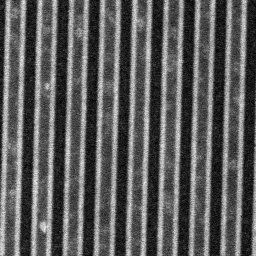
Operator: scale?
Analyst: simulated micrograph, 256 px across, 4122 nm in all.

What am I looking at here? parallel lines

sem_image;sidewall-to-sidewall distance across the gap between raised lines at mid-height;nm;248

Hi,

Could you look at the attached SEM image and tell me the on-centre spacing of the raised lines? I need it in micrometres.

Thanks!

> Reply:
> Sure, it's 0.508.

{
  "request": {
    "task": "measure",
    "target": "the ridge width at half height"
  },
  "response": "262 nm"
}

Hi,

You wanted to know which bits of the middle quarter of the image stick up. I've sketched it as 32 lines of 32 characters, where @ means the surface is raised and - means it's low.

-@@@@----@@@@----@@@@----@@@@---
-@@@@----@@@@----@@@@----@@@@---
-@@@@----@@@@----@@@@----@@@@---
-@@@@----@@@@----@@@@----@@@@---
-@@@@----@@@@----@@@@----@@@@---
-@@@@----@@@@----@@@@----@@@@---
-@@@@----@@@@----@@@@----@@@@---
-@@@@----@@@@----@@@@----@@@@---
-@@@@----@@@@----@@@@----@@@@---
-@@@@----@@@@----@@@@----@@@@---
-@@@@----@@@@----@@@@----@@@@---
-@@@@----@@@@----@@@@----@@@@---
-@@@@----@@@@----@@@@----@@@@---
-@@@@----@@@@----@@@@----@@@@---
-@@@@----@@@@----@@@@----@@@----
-@@@@----@@@@----@@@@----@@@----
-@@@@----@@@@----@@@@----@@@----
-@@@@----@@@@----@@@-----@@@----
-@@@@----@@@@----@@@-----@@@----
-@@@@----@@@@----@@@-----@@@----
-@@@@----@@@@----@@@----@@@@----
-@@@@----@@@@----@@@----@@@@----
-@@@@----@@@@----@@@----@@@@----
-@@@@----@@@@----@@@----@@@@----
-@@@-----@@@@---@@@@----@@@@----
-@@@-----@@@@---@@@@----@@@@----
-@@@-----@@@@---@@@@----@@@@----
-@@@----@@@@@---@@@@----@@@@----
-@@@----@@@@@----@@@----@@@@----
-@@@----@@@@-----@@@----@@@@----
-@@@----@@@@----@@@@----@@@@----
-@@@----@@@@----@@@@----@@@@----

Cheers